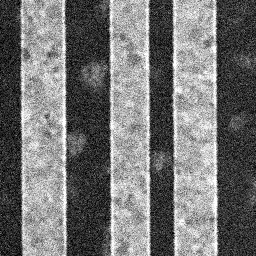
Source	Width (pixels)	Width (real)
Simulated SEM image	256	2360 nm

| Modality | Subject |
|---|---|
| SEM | one or a few lines or trenches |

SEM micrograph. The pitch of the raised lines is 698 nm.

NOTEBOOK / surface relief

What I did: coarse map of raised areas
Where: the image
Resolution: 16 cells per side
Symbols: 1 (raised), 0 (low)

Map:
0111000110011000
0111000110011000
0111000110011000
0111000110011000
0111000110011000
0111000110011000
0111000110011000
0111000110011000
0111000110011000
0111000110011000
0111000110011000
0111000110011000
0111000110011000
0111000110011000
0111000110011000
0111000110011100